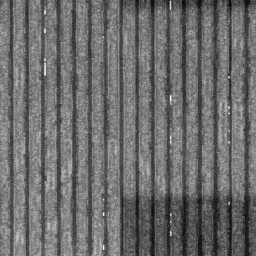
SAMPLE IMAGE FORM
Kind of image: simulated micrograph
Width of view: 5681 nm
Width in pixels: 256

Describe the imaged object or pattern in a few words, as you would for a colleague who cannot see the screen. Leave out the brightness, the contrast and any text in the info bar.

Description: parallel lines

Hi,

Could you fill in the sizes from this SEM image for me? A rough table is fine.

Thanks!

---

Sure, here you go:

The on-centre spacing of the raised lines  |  346 nanometers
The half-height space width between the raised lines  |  0.108 µm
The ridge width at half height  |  238 nm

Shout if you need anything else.